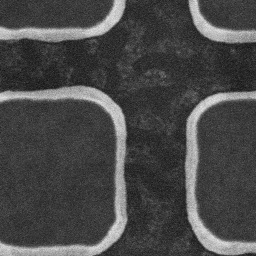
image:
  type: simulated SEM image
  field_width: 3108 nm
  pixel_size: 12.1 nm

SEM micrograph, raised bodies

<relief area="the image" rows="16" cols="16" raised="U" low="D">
UUUUUUUDDDDDUUUU
UUUUUUUDDDDDDUUU
DDDDDDDDDDDDDDDD
DDDDDDDDDDDDDDDD
DDDDDDDDDDDDDDDD
DDDDDDDDDDDDDDDD
UUUUUUUDDDDDDUUU
UUUUUUUDDDDDUUUU
UUUUUUUUDDDDUUUU
UUUUUUUUDDDDUUUU
UUUUUUUDDDDDUUUU
UUUUUUUDDDDDUUUU
UUUUUUUDDDDDUUUU
UUUUUUUDDDDDUUUU
UUUUUUUDDDDDDUUU
UUUUUUDDDDDDDDDD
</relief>